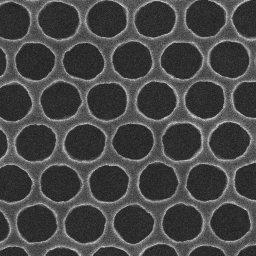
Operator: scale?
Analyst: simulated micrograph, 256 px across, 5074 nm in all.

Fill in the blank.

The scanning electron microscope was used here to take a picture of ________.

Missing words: a regular array of holes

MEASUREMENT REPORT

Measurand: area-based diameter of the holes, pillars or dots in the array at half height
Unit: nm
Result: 762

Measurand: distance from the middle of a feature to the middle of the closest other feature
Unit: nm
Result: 923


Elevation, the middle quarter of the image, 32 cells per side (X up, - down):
----------XX----------XX--------
----------XXX---------XXX-------
X--------XXXXX-------XXXXXX-----
XXXX---XXXXXXXX----XXXXXXXXX----
XXXXXXXXXXXXXXXXXXXXX---XXXXXXXX
--XXXXXX------XXXXXX------XXXXXX
---XXXX--------XXXX--------XXXX-
----XX----------XXX--------XXXX-
----XX----------XX----------XX--
----XX----------XX----------XX--
----XX----------XX----------XXX-
---XXX---------XXXX--------XXXX-
---XXXX--------XXXXX-------XXXXX
-XXXXXXX-----XXXXXXXX----XXXXXXX
XXXXXXXXXXXXXXXXXXXXXXXXXXXXXXXX
XXXX----XXXXXX------XXXXXXX-----
XX-------XXXX--------XXXXX------
X---------XXX---------XXX-------
----------XX----------XXX-------
----------XX----------XXX-------
----------XX----------XXX-------
X---------XXX---------XXX-------
X--------XXXXX-------XXXX-------
XX------XXXXXXXX----XXXXXXX-----
XXXXXXXXXXXXXXXXXXXXXXX-XXXXXXXX
XXXXXXXXXX---XXXXXXXX-----XXXXXX
--XXXXXX-------XXXXX-------XXXXX
---XXXX---------XXX---------XXX-
----XXX---------XXX---------XXX-
----XX----------XXX----------XX-
----XX----------XXX---------XXX-
----XXX---------XXX---------XXX-